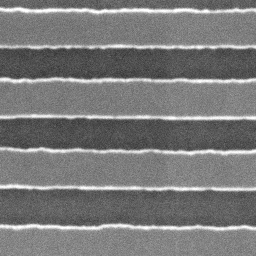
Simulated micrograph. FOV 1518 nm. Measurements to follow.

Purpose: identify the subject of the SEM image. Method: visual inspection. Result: lines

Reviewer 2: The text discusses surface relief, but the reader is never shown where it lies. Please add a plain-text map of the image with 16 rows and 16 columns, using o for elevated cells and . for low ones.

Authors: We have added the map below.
................
oooooooooooooooo
oooooooooooooooo
................
................
oooooooooooooooo
oooooooooooooooo
................
................
oooooooooooooooo
oooooooooooooooo
oooooooooooooooo
................
................
oooooooooooooooo
oooooooooooooooo